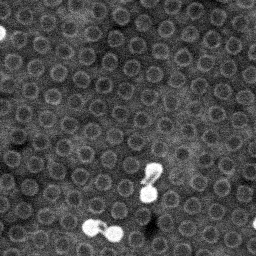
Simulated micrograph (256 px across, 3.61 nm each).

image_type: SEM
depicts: a regular array of raised bodies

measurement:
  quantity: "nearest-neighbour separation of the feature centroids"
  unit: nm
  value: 82.7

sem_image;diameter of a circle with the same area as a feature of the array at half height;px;16.1